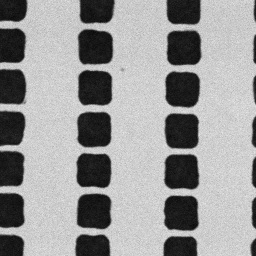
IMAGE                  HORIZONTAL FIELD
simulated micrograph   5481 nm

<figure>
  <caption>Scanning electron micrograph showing a regular array of holes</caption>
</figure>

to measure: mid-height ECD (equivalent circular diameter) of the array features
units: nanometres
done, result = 797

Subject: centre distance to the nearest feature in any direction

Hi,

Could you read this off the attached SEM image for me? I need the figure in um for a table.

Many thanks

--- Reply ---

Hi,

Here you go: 0.875